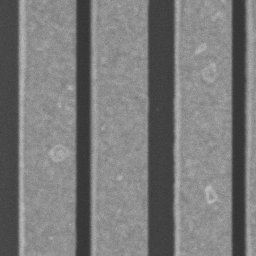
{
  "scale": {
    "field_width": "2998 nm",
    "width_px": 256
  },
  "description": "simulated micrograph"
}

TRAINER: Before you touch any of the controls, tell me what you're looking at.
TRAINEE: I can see lines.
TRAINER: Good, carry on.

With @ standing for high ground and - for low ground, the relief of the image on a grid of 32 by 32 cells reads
---@@@@@@--@@@@@@@----@@@@@@@--@
---@@@@@@--@@@@@@@----@@@@@@@--@
---@@@@@@--@@@@@@@----@@@@@@@--@
---@@@@@@--@@@@@@@----@@@@@@@--@
---@@@@@@--@@@@@@@----@@@@@@@--@
---@@@@@@--@@@@@@@----@@@@@@@--@
---@@@@@@--@@@@@@@----@@@@@@@--@
---@@@@@@--@@@@@@@----@@@@@@@--@
---@@@@@@--@@@@@@@----@@@@@@@--@
---@@@@@@--@@@@@@@----@@@@@@@--@
---@@@@@@--@@@@@@@----@@@@@@@--@
---@@@@@@--@@@@@@@----@@@@@@@--@
---@@@@@@--@@@@@@@----@@@@@@@--@
---@@@@@@--@@@@@@@----@@@@@@@--@
---@@@@@@---@@@@@@----@@@@@@@--@
---@@@@@@---@@@@@@----@@@@@@@--@
---@@@@@@---@@@@@@----@@@@@@@--@
--@@@@@@@---@@@@@@----@@@@@@@--@
---@@@@@@--@@@@@@@----@@@@@@@--@
---@@@@@@--@@@@@@@----@@@@@@@--@
---@@@@@@--@@@@@@@----@@@@@@@--@
---@@@@@@--@@@@@@@----@@@@@@@--@
---@@@@@@--@@@@@@@----@@@@@@@--@
---@@@@@@--@@@@@@@----@@@@@@@--@
---@@@@@@--@@@@@@@----@@@@@@@--@
---@@@@@@--@@@@@@@----@@@@@@@--@
---@@@@@@--@@@@@@@----@@@@@@@--@
---@@@@@@--@@@@@@@----@@@@@@@--@
---@@@@@@--@@@@@@@----@@@@@@@--@
---@@@@@@--@@@@@@@----@@@@@@@--@
---@@@@@@--@@@@@@@----@@@@@@@--@
---@@@@@@--@@@@@@@----@@@@@@@--@